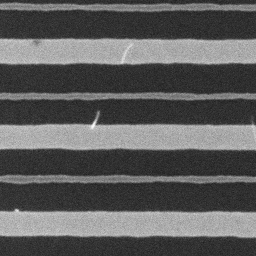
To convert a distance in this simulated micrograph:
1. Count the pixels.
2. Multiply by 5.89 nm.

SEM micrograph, lines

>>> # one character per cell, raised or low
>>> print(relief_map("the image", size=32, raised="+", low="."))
................................
................................
................................
................................
................................
++++++++++++++++++++++++++++++++
++++++++++++++++++++++++++++++++
++++++++++++++++++++++++++++++++
................................
................................
................................
................................
................................
................................
................................
...........+....................
++++++++++++++++++++++++++++++++
++++++++++++++++++++++++++++++++
+++++...++++++++++++++++++++++++
................................
................................
................................
................................
................................
................................
................................
+++.........++..................
++++++++++++++++++++++++++++++++
++++++++++++++++++++++++++++++++
..........+...+.+++..+.++.++.+++
................................
................................